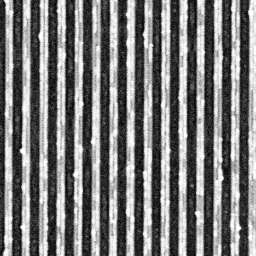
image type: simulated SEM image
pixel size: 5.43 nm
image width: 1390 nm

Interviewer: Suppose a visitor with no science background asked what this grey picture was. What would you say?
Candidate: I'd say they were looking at parallel lines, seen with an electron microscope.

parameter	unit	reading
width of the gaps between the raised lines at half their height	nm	59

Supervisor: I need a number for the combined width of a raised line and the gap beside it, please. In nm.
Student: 94.6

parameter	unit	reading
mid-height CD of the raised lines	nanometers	34.6